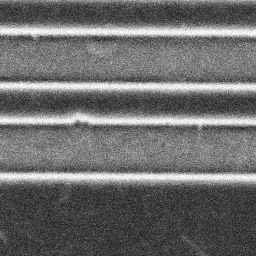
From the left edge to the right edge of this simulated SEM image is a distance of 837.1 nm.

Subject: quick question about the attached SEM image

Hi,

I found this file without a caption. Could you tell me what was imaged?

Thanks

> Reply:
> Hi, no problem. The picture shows one or a few lines or trenches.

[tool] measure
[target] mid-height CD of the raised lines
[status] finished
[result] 118 nanometers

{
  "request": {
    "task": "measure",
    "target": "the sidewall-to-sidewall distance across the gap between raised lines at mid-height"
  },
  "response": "175 nm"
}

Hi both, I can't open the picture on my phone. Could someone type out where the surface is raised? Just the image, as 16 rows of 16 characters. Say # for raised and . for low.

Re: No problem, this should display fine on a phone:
################
################
................
................
................
################
################
################
................
................
................
################
################
################
################
################